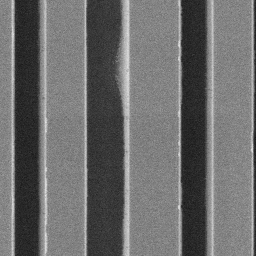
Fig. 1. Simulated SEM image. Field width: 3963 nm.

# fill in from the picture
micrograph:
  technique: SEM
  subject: lines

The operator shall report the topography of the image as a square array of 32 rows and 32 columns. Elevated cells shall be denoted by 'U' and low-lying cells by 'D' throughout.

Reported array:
UUDDDDUUUUUDDDDDUUUUUUDDDDUUUUUU
UUDDDDUUUUUDDDDDUUUUUUDDDDUUUUUU
UUDDDDUUUUUDDDDDUUUUUUDDDDUUUUUU
UUDDDDUUUUUDDDDDUUUUUUDDDDUUUUUU
UUDDDDUUUUUDDDDDUUUUUUDDDDUUUUUU
UUDDDDUUUUUDDDDDUUUUUUDDDDUUUUUU
UUDDDDUUUUUDDDDDUUUUUUDDDDUUUUUU
UUDDDDUUUUUDDDDDUUUUUUDDDDUUUUUU
UUDDDDUUUUUDDDDDUUUUUUDDDDUUUUUU
UUDDDDUUUUUDDDDDUUUUUUDDDDUUUUUU
UUDDDDUUUUUDDDDDUUUUUUDDDDUUUUUU
UUDDDDUUUUUDDDDDUUUUUUDDDDUUUUUU
UUDDDDUUUUUDDDDDUUUUUUDDDDUUUUUU
UUDDDDUUUUUDDDDDUUUUUUDDDDUUUUUU
UUDDDDUUUUUDDDDDUUUUUUDDDDUUUUUU
UUDDDDUUUUUDDDDDUUUUUUDDDDUUUUUU
UUDDDDUUUUUDDDDDUUUUUUDDDDUUUUUU
UUDDDDUUUUUDDDDDUUUUUUDDDDUUUUUU
UUDDDDUUUUUDDDDDUUUUUUDDDDUUUUUU
UUDDDDUUUUUDDDDDUUUUUUDDDDUUUUUU
UUDDDDUUUUUDDDDDUUUUUUDDDDUUUUUU
UUDDDDUUUUUDDDDDUUUUUUDDDDUUUUUU
UUDDDDUUUUUDDDDDUUUUUUDDDDUUUUUU
UUDDDDUUUUUDDDDDUUUUUUDDDDUUUUUU
UUDDDDUUUUUDDDDDUUUUUUDDDDUUUUUU
UUDDDDUUUUUDDDDDUUUUUUDDDDUUUUUU
UUDDDDUUUUUDDDDDUUUUUUDDDDUUUUUU
UUDDDDUUUUUDDDDDUUUUUUDDDDUUUUUU
UUDDDDUUUUUDDDDDUUUUUUDDDDUUUUUU
UUDDDDUUUUUDDDDDUUUUUUDDDDUUUUUU
UUDDDDUUUUUDDDDDUUUUUUDDDDUUUUUU
UUDDDDUUUUUDDDDDUUUUUUDDDDUUUUUU